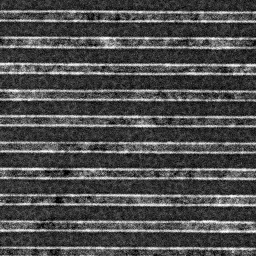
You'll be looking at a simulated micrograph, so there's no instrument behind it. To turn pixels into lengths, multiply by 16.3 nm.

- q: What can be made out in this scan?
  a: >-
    parallel lines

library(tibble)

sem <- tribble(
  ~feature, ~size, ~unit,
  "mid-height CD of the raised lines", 149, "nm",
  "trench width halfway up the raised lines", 0.283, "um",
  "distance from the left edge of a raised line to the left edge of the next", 427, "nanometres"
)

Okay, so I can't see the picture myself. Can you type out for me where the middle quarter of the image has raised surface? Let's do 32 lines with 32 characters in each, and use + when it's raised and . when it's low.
++++++++++++++++++++++++++++++++
++++++++++++++++++++++++++++++++
................................
................................
................................
................................
................................
++++++++++++++++++++++++++++++++
++++++++++++++++++++++++++++++++
................................
................................
................................
................................
++++++++++++++++++++++++++++++.+
++++++++++++++++++++++++++++++++
......................++++++++++
................................
................................
................................
................................
++++++++++++++++++++++++++++++++
++++++++++++++++++++++++++++++++
................................
................................
................................
................................
++++++++++++....+............+++
++++++++++++++++++++++++++++++++
.++++++++++++++++++++++++.......
................................
................................
................................